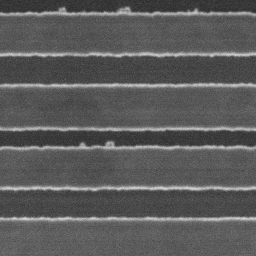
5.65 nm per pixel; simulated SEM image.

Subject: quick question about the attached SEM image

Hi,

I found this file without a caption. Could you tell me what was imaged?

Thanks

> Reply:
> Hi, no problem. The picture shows lines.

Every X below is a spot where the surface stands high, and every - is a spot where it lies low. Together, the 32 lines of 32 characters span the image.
--------------------------------
--------------------------------
XXXXXXXXXXXXXXXXXXXXXXXXXXXXXXXX
XXXXXXXXXXXXXXXXXXXXXXXXXXXXXXXX
XXXXXXXXXXXXXXXXXXXXXXXXXXXXXXXX
XXXXXXXXXXXXXXXXXXXXXXXXXXXXXXXX
XXXXXXXXXXXXXXXXXXXXXXXXXXXXXXXX
--------------------------------
--------------------------------
--------------------------------
--------------------------------
XXXXXXXXXXXXXXXXXXXXXXXXXXXXXXXX
XXXXXXXXXXXXXXXXXXXXXXXXXXXXXXXX
XXXXXXXXXXXXXXXXXXXXXXXXXXXXXXXX
XXXXXXXXXXXXXXXXXXXXXXXXXXXXXXXX
XXXXXXXXXXXXXXXXXXXXXXXXXXXXXXXX
--------------------------------
--------------------------------
XXXXXXXXXXXXXXXXXXXXXXXXXXXXXXXX
XXXXXXXXXXXXXXXXXXXXXXXXXXXXXXXX
XXXXXXXXXXXXXXXXXXXXXXXXXXXXXXXX
XXXXXXXXXXXXXXXXXXXXXXXXXXXXXXXX
XXXXXXXXXXXXXXXXXXXXXXXXXXXXXXXX
XXXXXXXXXXXXXXXXXXXXXXXXXXXXXXXX
--------------------------------
--------------------------------
--------------------------------
XXXXXXXXXXXXXXXXXXXXXXXXXXXXXXXX
XXXXXXXXXXXXXXXXXXXXXXXXXXXXXXXX
XXXXXXXXXXXXXXXXXXXXXXXXXXXXXXXX
XXXXXXXXXXXXXXXXXXXXXXXXXXXXXXXX
XXXXXXXXXXXXXXXXXXXXXXXXXXXXXXXX